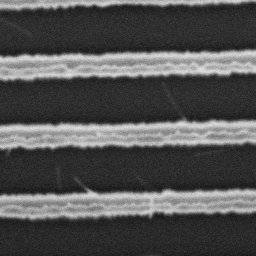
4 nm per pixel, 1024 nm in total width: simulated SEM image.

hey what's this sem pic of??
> lines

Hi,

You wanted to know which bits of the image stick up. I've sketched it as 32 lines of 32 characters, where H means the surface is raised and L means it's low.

HHHHHHHHHLLLHLLLLLLLLLLLLLLLLLLL
LLLLLLLLLLLLLLLLLLLLLLLLLLLLLLLL
LLLLLLLLLLLLLLLLLLLLLLLLLLLLLLLL
LLLLLLLLLLLLLLLLLLLLLLLLLLLLLLLL
LLLLLLLLLLLLLLLLLLLLLLLLLLLLLLLL
LLLLLLLLLLLLLLLLLLLLLLLLLLLLLLLL
LLLLLLLLLLLLLLLLLLLLLLLLLLLLLLLL
HHHHHHHHHHHHHHHHHHHHHHHHHHHHHHHH
HHHHHHHHHHHHHHHHHHHHHHHHHHHHHHHH
HHHHLLLLLLLLLLLLLLLLLLLLLLLLLLLL
LLLLLLLLLLLLLLLLLLLLLLLLLLLLLLLL
LLLLLLLLLLLLLLLLLLLLLLLLLLLLLLLL
LLLLLLLLLLLLLLLLLLLLLLLLLLLLLLLL
LLLLLLLLLLLLLLLLLLLLLLLLLLLLLLLL
LLLLLLLLLLLLLLLLLLLLLLLLLLLLLLLL
LLLLLLLLLLLLLLLLLLLLLLHLLLHHLHHH
HHHHHHHHHHHHHHHHHHHHHHHHHHHHHHHH
HHHHHHHHHHHHHHHHHHHHHHHHHHHHHHHH
LLLLLLLLLLLLLLLLLLLLLLLLLLLLLLLL
LLLLLLLLLLLLLLLLLLLLLLLLLLLLLLLL
LLLLLLLLLLLLLLLLLLLLLLLLLLLLLLLL
LLLLLLLLLLLLLLLLLLLLLLLLLLLLLLLL
LLLLLLLLLLLLLLLLLLLLLLLLLLLLLLLL
LLLLLLLLLLLLLLLLLLLLLLLLLLLLLLLL
LLLLLLLLLHHHHHHHHHHHHHHHHHHHHHHH
HHHHHHHHHHHHHHHHHHHHHHHHHHHHHHHH
HHHHHHHHHHHHHHHHHHHLLLLLLLLLLLLL
LLLLLLLLLLLLLLLLLLLLLLLLLLLLLLLL
LLLLLLLLLLLLLLLLLLLLLLLLLLLLLLLL
LLLLLLLLLLLLLLLLLLLLLLLLLLLLLLLL
LLLLLLLLLLLLLLLLLLLLLLLLLLLLLLLL
LLLLLLLLLLLLLLLLLLLLLLLLLLLLLLLL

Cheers